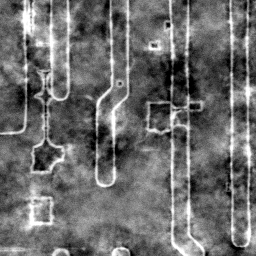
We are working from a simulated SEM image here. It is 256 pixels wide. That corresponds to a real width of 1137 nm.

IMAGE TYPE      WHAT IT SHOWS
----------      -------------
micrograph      wiring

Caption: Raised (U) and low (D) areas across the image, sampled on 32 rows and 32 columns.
UUUDDDUUDDDDDDUUDDDDDUUUDDDDDUUD
UUUDDDUUUDDDDDUUDDDDDUUUDDDDDUUD
UUUDDDUUUDDDDDUUDDDDDUUUDDDDDUUD
UUUDDDUUUDDDDDUUDDDDDUUUDDDDDUUD
UUUDDDUUUDDDDDUUDDDDDUUDDDDDDUUD
UUUDDDUUUDDDDDUUDDDDDUUDDDDDDUUD
UUUDDDUUUDDDDDUUDDDDDDUDDDDDDUUD
UUUDDDDUUDDDDDUUDDDDDDUDDDDDDUUD
UUUDDDDUUDDDDDUUDDDDDDUDDDDDDUUD
UUUDDDDUUDDDDDUUDDDDDUUDDDDDDUUD
UUUDDDDUUDDDDDUUDDDDDUUUDDDDDUUD
UUUDDDDUUDDDDUUUDDDDDUUUDDDDDUUD
UUUDDDDDDDDDUUUDDDDDDUUUDDDDDUUD
UUUDDDDDDDDDUUUDDDDDDDUDDDDDDUUD
UUUDDDDDDDDDUUDDDDDDDDUUDDDDDUUD
UUUDDDDDDDDDUUDDDDDDDDUUDDDDDUUD
UUUDDDDDDDDDUUDDDDDDDUUUDDDDDUUD
DDDDDDDDDDDDUUDDDDDDDUUUDDDDDUUD
DDDDDDDDDDDDUUDDDDDDDDUUDDDDDUUD
DDDDDDDDDDDDUUDDDDDDDUUUDDDDDUUD
DDDDDDDDDDDDUUDDDDDDDUUUDDDDDUUD
DDDDDDDDDDDDUUDDDDDDDUUUDDDDDUUD
DDDDDDDDDDDDUUDDDDDDDUUUDDDDDUUD
DDDDDDDDDDDDDDDDDDDDDUUUDDDDDUUD
DDDDDDDDDDDDDDDDDDDDDDUUDDDDDUUD
DDDDDDDDDDDDDDDDDDDDDDUUDDDDDUUD
DDDDDDDDDDDDDDDDDDDDDDUUDDDDDUUD
DDDDDDDDDDDDDDDDDDDDDDUUDDDDDUUD
DDDDDDDDDDDDDDDDDDDDDDUUDDDDDUUD
DDDDDDDDDDDDDDDDDDDDDDUUDDDDDUUD
DDDDDDDDDDDDDDDDDDDDDDUUUDDDDUUD
DDDDDDDUDDDDDDUUDDDDDDDUUDDDDDDD